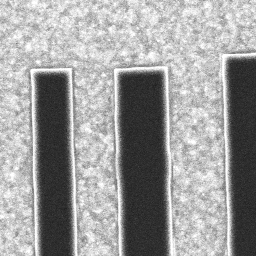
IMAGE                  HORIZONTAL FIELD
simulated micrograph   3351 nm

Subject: one or a few lines or trenches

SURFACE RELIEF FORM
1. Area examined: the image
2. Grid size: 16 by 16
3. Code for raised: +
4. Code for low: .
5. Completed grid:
................
................
................
..............++
..++...+++....++
..++...+++....++
..++...+++....++
..+++..++++...++
..+++..++++...++
..+++..++++...++
..+++..++++...++
..+++..++++...++
..+++..++++...++
..+++..++++...++
..+++..++++...++
..+++...+++...++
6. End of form